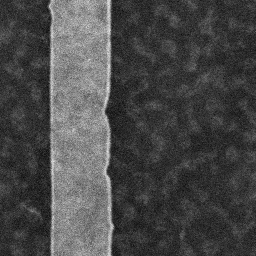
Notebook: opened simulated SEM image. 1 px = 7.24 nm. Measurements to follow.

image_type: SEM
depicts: one or a few lines or trenches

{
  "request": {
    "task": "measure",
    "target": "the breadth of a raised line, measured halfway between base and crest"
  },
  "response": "411 nm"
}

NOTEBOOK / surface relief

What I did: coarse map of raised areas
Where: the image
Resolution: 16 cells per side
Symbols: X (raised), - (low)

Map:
---XXXX---------
---XXXX---------
---XXXX---------
---XXXX---------
---XXXX---------
---XXXX---------
---XXXX---------
---XXXX---------
---XXXX---------
---XXXX---------
---XXXX---------
---XXXX---------
---XXXX---------
---XXXX---------
---XXXX---------
---XXXX---------